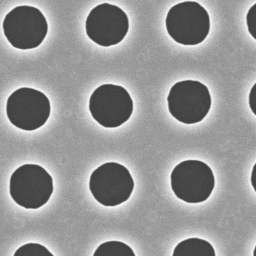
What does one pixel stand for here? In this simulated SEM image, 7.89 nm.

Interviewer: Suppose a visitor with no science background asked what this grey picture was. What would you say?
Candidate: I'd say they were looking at a regular array of holes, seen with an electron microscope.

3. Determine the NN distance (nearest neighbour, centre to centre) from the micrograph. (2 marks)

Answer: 78.6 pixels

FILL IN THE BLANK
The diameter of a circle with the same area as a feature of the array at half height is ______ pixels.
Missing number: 43.9